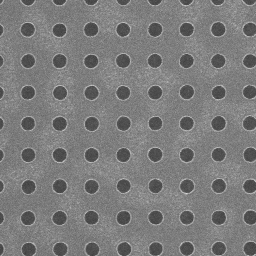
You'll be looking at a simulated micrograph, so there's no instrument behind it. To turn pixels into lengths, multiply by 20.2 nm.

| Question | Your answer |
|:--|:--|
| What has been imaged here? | a regular array of holes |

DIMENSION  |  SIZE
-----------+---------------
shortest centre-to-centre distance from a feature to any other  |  626 nm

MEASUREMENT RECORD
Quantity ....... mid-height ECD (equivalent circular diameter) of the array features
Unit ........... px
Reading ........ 14.2